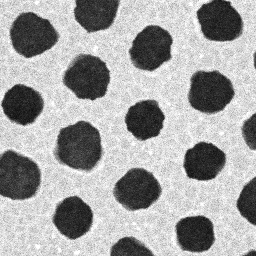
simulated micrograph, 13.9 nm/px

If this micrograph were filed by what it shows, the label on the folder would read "a regular array of holes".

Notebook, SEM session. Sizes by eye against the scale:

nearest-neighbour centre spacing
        970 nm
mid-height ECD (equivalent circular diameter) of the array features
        603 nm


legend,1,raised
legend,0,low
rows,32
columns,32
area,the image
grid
11111111100000011111111111000111
11101111100000011111111110000011
11000011100000111111111110000011
10000001110000111100111110000011
10000001111111111000011111000011
11000001111111111000001111111111
11000011111111110000011111111111
11111111100001110000011111111111
11111111100001111000111111111111
11111111000000111111111100001111
11011111000000111111111100000111
10000111100001111111111100000111
00000111111011111101111100000111
00000111111111110000111100001111
10000111111111110000011111111110
11011111100111110000111111111110
11111110000011110000111111111100
11111110000001111111111111111110
11111110000001111111111100011110
00011110000001111111111000001111
00000111000011111111111000001111
00000111111111110001111000011111
00000111111111100000111110111110
00000111111111000000111111111100
00001111111111000000111111111100
11111110000111100001111111111100
11111110000011111111111111111100
11111110000011111111111000111110
11111110000111111111110000011111
11111111001111111111110000011111
11111111111111000011110000011111
11111111111111000001111111111110